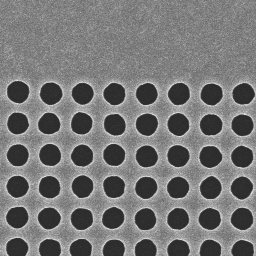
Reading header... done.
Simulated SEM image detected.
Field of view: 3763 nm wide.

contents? a regular array of holes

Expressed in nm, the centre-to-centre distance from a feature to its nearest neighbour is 455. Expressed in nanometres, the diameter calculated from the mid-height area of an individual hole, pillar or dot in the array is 324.